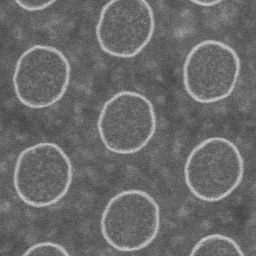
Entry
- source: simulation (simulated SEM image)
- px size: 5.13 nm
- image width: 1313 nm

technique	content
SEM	raised bodies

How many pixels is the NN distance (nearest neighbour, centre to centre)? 97.7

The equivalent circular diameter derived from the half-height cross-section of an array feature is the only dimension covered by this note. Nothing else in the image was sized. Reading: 0.29 micrometres